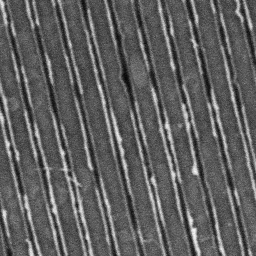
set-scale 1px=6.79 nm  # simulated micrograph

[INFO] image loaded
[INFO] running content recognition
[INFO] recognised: parallel lines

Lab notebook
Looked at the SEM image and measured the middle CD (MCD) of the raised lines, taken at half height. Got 55.5 nm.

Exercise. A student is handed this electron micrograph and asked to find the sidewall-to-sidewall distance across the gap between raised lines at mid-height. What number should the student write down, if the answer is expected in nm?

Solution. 120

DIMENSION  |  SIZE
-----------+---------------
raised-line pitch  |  25.7 px